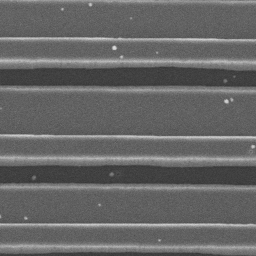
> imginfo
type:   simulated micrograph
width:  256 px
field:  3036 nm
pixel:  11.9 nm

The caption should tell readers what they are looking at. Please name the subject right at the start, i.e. lines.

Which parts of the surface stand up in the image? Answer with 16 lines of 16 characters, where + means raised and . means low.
++++++++++++++++
++++++++++++++++
++++++++++++++++
++++++++++++++++
................
+...............
++++++++++++++++
++++++++++++++++
++++++++++++++++
++++++++++++++++
................
................
++++++++++++++++
++++++++++++++++
++++++++++++++++
++....++++++++++